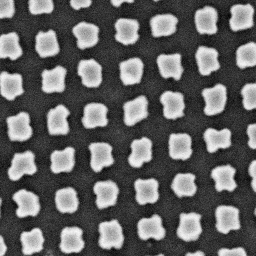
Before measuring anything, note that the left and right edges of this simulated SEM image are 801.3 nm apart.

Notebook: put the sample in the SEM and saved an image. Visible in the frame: a regular array of raised bodies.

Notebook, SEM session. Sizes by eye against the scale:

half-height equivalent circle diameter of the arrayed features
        77.1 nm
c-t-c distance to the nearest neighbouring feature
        38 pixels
